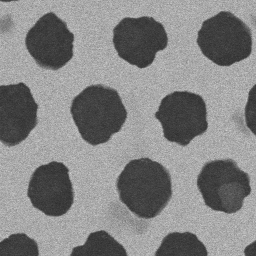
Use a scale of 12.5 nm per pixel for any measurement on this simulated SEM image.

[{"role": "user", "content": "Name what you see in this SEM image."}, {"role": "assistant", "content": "a regular array of holes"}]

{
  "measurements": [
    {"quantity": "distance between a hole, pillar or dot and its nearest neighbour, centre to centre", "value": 1.06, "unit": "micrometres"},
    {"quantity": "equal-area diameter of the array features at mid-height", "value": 651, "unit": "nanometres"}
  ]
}